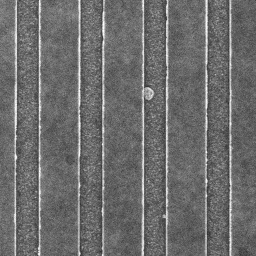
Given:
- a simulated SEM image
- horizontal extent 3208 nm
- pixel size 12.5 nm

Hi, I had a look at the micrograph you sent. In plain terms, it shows lines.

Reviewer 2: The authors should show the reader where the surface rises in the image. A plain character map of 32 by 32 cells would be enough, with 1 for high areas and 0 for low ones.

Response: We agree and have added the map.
11000111110001111100011111000111
11000111110001111100011111000111
11000111110001111100011111000111
11000111110001111100011111000111
11000111110001111100011111000111
11000111110001111100011111000111
11000111110001111100011111000111
11000111110001111100011111000111
11000111110001111100011111000111
11000111110001111100011111000111
11000111110001111100011111000111
11000111110001111100011111000111
11000111110001111100011111000111
11000111110001111100011111000111
11000111110001111100011111000111
11000111110001111100011111000111
11000111110001111100011111000111
11000111110001111100011111000111
11000111110001111100011111000111
11000111110001111100011111000111
11000111110001111100011111000111
11000111110001111100011111000111
11000111110001111100011111000111
11000111110001111100011111000111
11000111110001111100011111000111
11000111110001111100011111000111
11000111110001111100011111000111
11000111110001111100011111000111
11000111110001111100011111000111
11000111110001111100011111000111
11000111110001111100011111000111
11000111110001111100011111000111